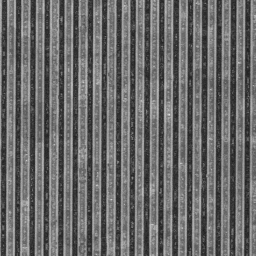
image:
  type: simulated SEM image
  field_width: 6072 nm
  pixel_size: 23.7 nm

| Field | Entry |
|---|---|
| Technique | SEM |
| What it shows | parallel lines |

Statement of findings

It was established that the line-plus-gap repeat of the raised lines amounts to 0.34 µm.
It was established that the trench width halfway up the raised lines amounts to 163 nm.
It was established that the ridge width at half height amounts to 166 nm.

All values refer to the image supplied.